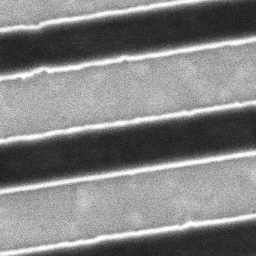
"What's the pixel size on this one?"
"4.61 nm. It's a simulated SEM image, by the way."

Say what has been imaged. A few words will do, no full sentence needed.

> one or a few lines or trenches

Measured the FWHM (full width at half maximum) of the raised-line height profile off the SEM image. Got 51 px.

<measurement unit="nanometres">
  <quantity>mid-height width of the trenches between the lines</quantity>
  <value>281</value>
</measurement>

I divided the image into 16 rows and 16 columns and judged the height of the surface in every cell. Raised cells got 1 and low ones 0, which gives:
0000000001111111
0001111111111111
1111111111111111
1111111111000000
1100000000000000
0000000000000000
0000000000000001
0000000001111111
0011111111111111
1111111111111111
1111111111000000
1110000000000000
0000000000000000
0000000000000000
0000000001111111
0001111111111111